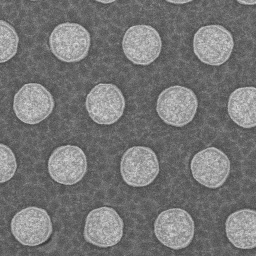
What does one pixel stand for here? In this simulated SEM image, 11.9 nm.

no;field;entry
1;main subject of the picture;a regular array of raised bodies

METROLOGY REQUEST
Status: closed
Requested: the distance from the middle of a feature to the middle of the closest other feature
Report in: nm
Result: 840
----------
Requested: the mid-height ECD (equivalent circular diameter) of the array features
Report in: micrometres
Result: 0.468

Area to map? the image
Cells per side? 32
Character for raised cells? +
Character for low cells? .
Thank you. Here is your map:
...............................+
................................
................................
+......+++......+++......+++....
++....+++++.....++++....+++++...
++....+++++....+++++....+++++...
++.....++++.....++++....+++++...
+.......++......+++......+++....
................................
................................
...++.......+...................
..++++.....++++.....++++.....+++
..+++++....++++.....+++++....+++
..+++++....++++.....+++++....+++
..++++.....++++.....++++.....+++
......................+.......++
................................
................................
+......+++......++........+.....
++....+++++....++++.....++++....
++....+++++....+++++....+++++...
++....+++++....+++++....++++....
+......+++......+++......+++....
................................
................................
................................
..++++.....+++......+++.......++
..++++.....++++.....++++.....+++
.+++++.....++++....+++++....++++
..++++.....++++.....++++....++++
...++.......++......+++......+++
................................